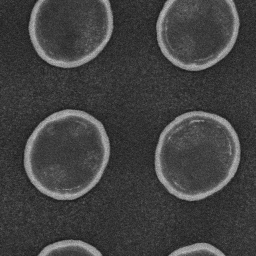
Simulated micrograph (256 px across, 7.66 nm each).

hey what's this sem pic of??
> raised bodies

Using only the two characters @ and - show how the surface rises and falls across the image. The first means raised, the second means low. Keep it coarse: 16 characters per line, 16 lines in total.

--@@@@@---@@@@@-
--@@@@@---@@@@@-
--@@@@@---@@@@@-
---@@@-----@@@--
----------------
----------------
----------------
---@@@-----@@@--
--@@@@@---@@@@@-
--@@@@@---@@@@@-
--@@@@----@@@@@-
--@@@@----@@@@--
----------------
----------------
----------------
---@@@------@---